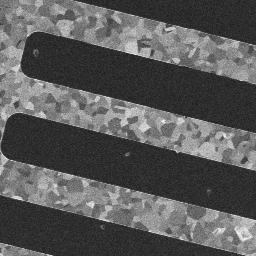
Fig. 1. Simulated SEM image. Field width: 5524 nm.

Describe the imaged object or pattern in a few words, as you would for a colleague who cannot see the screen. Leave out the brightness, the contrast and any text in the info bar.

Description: one or a few lines or trenches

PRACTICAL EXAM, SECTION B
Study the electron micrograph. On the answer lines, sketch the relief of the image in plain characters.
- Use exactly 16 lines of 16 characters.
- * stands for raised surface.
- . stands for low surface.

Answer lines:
******..........
***********.....
**...**********.
*........*******
*............***
****............
********........
...*********....
.......*********
...........*****
***............*
*******.........
.**********.....
.....**********.
.........*******
*............***